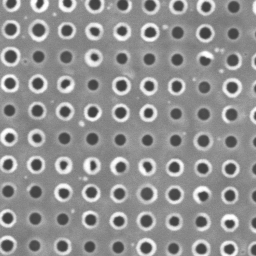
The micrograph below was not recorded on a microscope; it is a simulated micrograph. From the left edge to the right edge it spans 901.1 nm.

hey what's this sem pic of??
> a regular array of holes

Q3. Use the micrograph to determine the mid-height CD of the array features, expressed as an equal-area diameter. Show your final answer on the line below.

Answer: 40.3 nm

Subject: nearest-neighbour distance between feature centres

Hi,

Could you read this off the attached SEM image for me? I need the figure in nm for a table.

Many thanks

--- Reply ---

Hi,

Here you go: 94.1